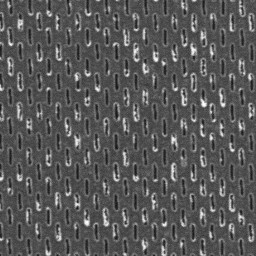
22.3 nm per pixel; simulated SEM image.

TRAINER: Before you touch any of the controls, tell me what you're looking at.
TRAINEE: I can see a regular array of holes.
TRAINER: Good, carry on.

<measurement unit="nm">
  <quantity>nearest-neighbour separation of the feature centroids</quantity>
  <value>379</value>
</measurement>